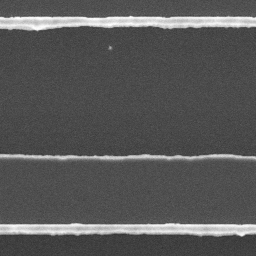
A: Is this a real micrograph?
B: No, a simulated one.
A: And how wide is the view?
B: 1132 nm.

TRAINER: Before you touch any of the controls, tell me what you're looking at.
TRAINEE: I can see lines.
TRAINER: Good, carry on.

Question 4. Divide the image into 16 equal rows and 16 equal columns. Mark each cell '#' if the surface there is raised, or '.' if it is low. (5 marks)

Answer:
################
################
................
................
................
................
................
................
................
................
################
################
################
################
#######.########
................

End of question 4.